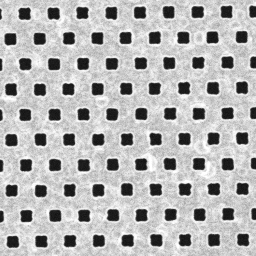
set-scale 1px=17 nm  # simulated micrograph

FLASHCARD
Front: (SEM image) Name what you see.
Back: a regular array of holes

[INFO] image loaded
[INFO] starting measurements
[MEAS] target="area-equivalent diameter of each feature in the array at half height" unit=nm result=225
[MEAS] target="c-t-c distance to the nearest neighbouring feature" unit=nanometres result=485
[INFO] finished